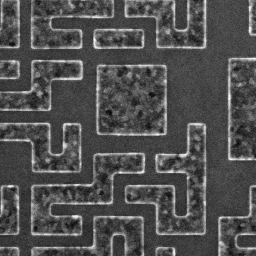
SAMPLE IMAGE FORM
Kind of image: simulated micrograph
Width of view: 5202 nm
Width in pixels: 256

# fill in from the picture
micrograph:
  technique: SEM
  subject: wiring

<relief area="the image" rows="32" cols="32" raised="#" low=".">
##..##########..######..##.....#
##..##########..######..##.....#
##..##.............###..##.....#
##..###.............##.###.....#
##..######..######..######......
##..######..######..######......
................................
.............................###
##..######..#########........###
##..######..#########........###
....##......#########........###
...###......#########........###
######......#########........###
######......#########........###
............#########........###
............#########........###
######..##..#########...##...###
######..##..............##...###
....##..##..............##...###
....######..######..######...###
....######..######..######......
............######.....###......
............##..........##......
##..##########..######..##.....#
##..##########..######..##.....#
##..###............###..##.....#
##..##..............##.###.....#
##..######..######..######.#####
##..######..######..######.#####
............##.###.........###..
............##..##.........###..
##..##########..##..##.....#####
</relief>